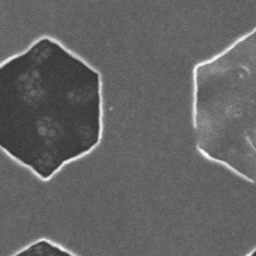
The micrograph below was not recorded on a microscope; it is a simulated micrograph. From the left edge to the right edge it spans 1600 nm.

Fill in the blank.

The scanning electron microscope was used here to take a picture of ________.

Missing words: holes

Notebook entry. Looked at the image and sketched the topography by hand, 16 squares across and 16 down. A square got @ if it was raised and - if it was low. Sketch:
@@@@@@@@@@@@@@@@
@@@@@@@@@@@@@@@@
@@@@@@@@@@@@@@@@
@----@@@@@@@@@@@
------@@@@@@@@@@
------@@@@@@@@@@
------@@@@@@@@@@
------@@@@@@@@@@
------@@@@@@@@@@
@----@@@@@@@@@@@
@@--@@@@@@@@@@@@
@@@@@@@@@@@@@@@@
@@@@@@@@@@@@@@@@
@@@@@@@@@@@@@@@@
@@@@@@@@@@@@@@@@
@@--@@@@@@@@@@@@